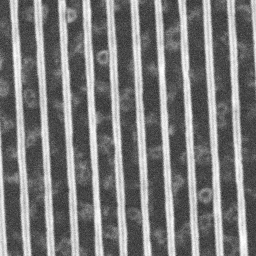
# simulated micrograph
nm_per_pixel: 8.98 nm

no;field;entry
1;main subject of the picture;parallel lines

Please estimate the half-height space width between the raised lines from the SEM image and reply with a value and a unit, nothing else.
170 nm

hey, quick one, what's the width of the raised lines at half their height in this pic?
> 40.4 nanometres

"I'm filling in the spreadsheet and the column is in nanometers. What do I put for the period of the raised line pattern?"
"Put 216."